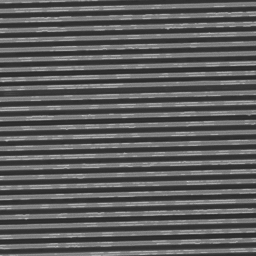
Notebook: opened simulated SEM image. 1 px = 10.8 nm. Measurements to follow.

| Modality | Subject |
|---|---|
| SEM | parallel lines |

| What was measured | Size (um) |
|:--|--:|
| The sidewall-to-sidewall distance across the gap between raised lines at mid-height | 0.0501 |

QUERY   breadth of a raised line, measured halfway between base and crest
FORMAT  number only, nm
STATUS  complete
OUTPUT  51.4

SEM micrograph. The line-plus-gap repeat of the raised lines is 106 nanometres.